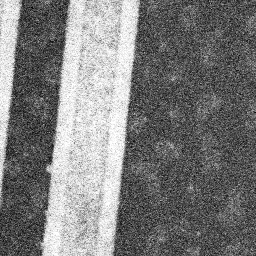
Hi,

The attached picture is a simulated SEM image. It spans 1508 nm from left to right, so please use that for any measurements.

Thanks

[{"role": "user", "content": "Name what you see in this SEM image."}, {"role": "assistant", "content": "one or a few lines or trenches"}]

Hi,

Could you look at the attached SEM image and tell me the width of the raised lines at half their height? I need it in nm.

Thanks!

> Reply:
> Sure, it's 297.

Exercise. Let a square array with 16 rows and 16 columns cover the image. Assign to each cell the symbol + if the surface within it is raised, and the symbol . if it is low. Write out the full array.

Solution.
+....+++........
+....+++........
.....+++........
.....+++........
....++++........
....++++........
....+++.........
....+++.........
....+++.........
....+++.........
....+++.........
....+++.........
....+++.........
....+++.........
...++++.........
...+++..........